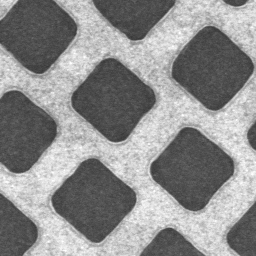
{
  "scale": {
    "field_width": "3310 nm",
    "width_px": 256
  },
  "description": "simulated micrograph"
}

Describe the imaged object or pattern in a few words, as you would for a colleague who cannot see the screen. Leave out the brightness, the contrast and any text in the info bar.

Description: holes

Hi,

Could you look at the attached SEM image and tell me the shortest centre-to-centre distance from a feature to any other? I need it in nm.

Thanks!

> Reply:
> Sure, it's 1330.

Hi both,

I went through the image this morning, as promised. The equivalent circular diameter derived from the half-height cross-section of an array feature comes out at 981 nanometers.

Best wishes